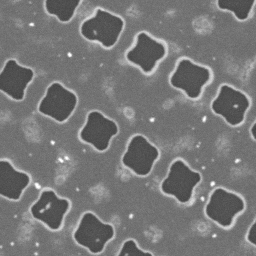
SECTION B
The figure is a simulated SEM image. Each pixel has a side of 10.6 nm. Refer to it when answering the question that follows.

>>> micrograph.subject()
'a regular array of holes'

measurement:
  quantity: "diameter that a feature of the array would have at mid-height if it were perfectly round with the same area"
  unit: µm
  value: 0.376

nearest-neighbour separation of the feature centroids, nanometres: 521